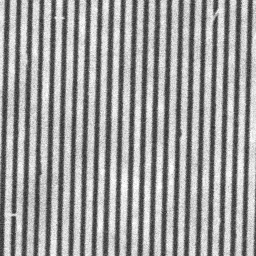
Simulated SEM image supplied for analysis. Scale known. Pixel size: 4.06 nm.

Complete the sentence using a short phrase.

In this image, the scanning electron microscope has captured parallel lines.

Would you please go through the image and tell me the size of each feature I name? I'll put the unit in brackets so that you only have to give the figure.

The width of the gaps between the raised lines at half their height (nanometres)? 20.8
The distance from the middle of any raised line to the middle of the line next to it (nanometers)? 46.9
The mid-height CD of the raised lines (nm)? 24.3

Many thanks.